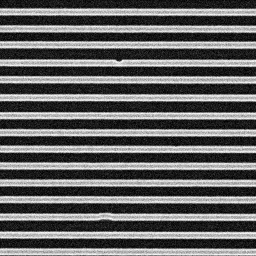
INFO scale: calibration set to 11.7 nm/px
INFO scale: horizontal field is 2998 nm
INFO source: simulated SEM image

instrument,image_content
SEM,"parallel lines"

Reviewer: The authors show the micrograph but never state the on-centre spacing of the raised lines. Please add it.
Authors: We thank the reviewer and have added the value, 201 nm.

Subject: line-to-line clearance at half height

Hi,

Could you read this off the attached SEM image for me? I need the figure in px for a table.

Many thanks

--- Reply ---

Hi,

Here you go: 11.4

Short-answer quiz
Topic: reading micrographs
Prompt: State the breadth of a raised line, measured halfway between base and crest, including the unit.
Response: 61.5 nm